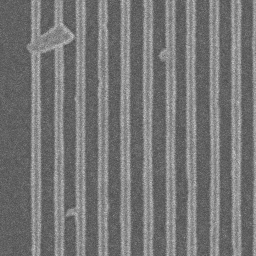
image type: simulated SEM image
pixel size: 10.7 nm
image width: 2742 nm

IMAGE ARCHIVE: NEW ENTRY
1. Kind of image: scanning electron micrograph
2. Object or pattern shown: parallel lines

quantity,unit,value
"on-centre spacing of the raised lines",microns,0.239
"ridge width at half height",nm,71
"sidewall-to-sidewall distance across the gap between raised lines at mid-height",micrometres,0.174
